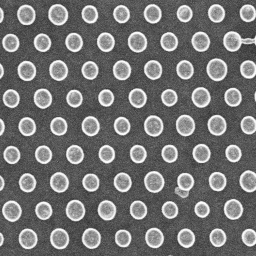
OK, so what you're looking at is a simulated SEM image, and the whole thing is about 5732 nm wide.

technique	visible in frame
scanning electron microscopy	a regular array of raised bodies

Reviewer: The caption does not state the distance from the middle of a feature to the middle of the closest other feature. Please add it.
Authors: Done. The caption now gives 707 nm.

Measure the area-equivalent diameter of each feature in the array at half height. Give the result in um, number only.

0.379